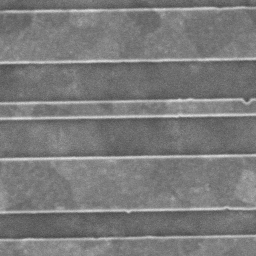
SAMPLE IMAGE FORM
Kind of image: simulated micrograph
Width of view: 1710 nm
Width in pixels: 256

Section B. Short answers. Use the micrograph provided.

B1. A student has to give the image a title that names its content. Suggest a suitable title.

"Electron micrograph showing one or a few lines or trenches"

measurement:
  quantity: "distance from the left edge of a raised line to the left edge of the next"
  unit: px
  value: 74.2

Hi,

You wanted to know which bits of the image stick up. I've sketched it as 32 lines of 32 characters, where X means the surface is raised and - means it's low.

--------------------------------
-XXXXXXXXXXXXXXXXXXXXXXXXXXXXXXX
XXXXXXXXXXXXXXXXXXXXXXXXXXXXXXXX
XXXXXXXXXXXXXXXXXXXXXXXXXXXXXXXX
XXXXXXXXXXXXXXXXXXXXXXXXXXXXXXXX
XXXXXXXXXXXXXXXXXXXXXXXXXXXXXXXX
XXXXXXXXXXXXXXXXXXXXXXXXXXXXXXXX
XXXXXXXXXXXXXXXXXXXX----X-------
--------------------------------
--------------------------------
--------------------------------
--------------------------------
----------------------XXX---XX-X
XXXXXXXXXXXXXXXXXXXXXXXXXXXXXXXX
XXXXXXXXXXXXXXXXXXXXX-----------
--------------------------------
--------------------------------
--------------------------------
--------------------------------
------------------------------XX
XXXXXXXXXXXXXXXXXXXXXXXXXXXXXXXX
XXXXXXXXXXXXXXXXXXXXXXXXXXXXXXXX
XXXXXXXXXXXXXXXXXXXXXXXXXXXXXXXX
XXXXXXXXXXXXXXXXXXXXXXXXXXXXXXXX
XXXXXXXXXXXXXXXXXXXXXXXXXXXXXXXX
XXXXXXXXXXXXXXXXXXXXXXXXXXXXXXXX
X---X---------------------------
--------------------------------
--------------------------------
--------------------------------
XXXXXXXXXXXXXXXXXXXXXXXXXXXXXXXX
XXXXXXXXXXXXXXXXXXXXXXXXXXXXXXXX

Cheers